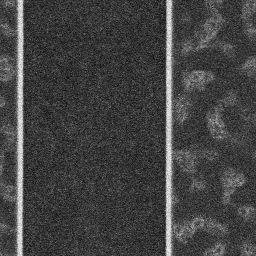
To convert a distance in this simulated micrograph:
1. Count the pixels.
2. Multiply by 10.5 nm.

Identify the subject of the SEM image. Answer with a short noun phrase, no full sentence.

one or a few lines or trenches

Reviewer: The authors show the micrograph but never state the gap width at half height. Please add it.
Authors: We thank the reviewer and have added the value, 148 pixels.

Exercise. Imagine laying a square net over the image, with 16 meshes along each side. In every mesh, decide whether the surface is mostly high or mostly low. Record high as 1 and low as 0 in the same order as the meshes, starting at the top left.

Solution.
1000000000011111
1000000000011111
1000000000011111
1000000000011111
1000000000011111
1000000000011111
1000000000011111
1000000000011111
1000000000011111
1000000000011111
1000000000011111
1000000000011111
1000000000011111
1000000000011111
1000000000011111
1000000000011111